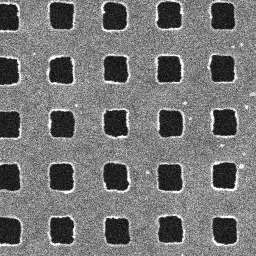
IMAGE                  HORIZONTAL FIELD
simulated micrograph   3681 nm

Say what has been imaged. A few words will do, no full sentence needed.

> a regular array of holes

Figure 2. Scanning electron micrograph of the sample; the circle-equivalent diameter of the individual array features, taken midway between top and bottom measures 399 nm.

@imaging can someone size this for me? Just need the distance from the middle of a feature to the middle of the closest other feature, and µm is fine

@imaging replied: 0.762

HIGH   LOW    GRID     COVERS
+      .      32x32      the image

..++++...++++..+++++..+++++..+++
..++++...++++...++++...+++...+++
..++++...++++...++++...+++...+++
..+++++..++++...++++..+++++..+++
++++++++++++++++++++++++++++++++
++++++++++++++++++++++++++++++++
++++++++++++++++++++++++++++++++
..+++++..++++...++++..++++...+++
..++++...++++...++++...+++...+++
..++++...++++...++++...+++...+++
.+++++++.+++++++++++++++++++++++
++++++++++++++++++++++++++++++++
++++++++++++++++++++++++++++++++
++++++++++++++++++++++++++++++++
..++++...++++...++++...++++..+++
...+++...++++...++++...++++...++
..++++...++++...++++...++++...++
++++++++++++++++++++++++++++++++
++++++++++++++++++++++++++++++++
++++++++++++++++++++++++++++++++
+++++++.+++++..++++++++++++..+++
..++++...++++...++++...++++...++
...+++...++++...++++...++++..+++
..++++...++++...++++...++++..+++
++++++++++++++++++++++++++++++++
++++++++++++++++++++++++++++++++
++++++++++++++++++++++++++++++++
..++++...++++...++++...++++..+++
...+++...++++...++++...++++...++
...+++...++++...++++...++++...++
..++++++++++++..++++++++++++.+++
++++++++++++++++++++++++++++++++